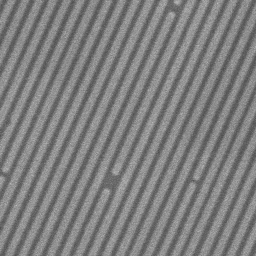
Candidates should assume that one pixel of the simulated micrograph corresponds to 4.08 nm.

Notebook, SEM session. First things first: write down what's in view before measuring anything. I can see parallel lines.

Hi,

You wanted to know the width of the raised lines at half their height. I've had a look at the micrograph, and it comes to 0.0252 µm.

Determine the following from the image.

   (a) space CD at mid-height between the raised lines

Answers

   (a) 28.4 nm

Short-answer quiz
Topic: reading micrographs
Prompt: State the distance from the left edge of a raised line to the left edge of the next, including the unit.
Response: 51.7 nm